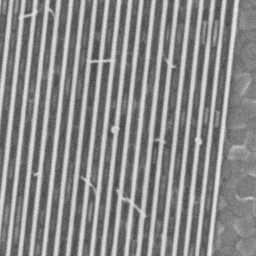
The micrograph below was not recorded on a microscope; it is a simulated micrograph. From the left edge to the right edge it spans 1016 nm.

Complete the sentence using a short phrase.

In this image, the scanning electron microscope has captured parallel lines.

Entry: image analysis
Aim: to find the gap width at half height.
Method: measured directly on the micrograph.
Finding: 33.6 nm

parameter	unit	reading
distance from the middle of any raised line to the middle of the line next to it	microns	0.0468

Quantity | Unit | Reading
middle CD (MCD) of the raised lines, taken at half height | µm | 0.0114